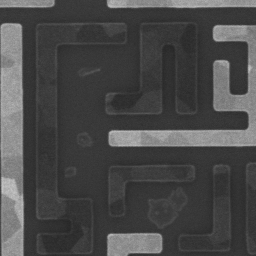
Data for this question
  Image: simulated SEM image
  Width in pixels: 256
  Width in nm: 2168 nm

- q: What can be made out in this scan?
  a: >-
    wiring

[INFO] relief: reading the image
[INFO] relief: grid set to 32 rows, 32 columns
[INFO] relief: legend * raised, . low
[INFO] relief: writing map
*******......*******************
................................
................................
***..***********..*******..*****
***..***********..*******..*****
***..***..........*******......*
***..**...........**..***......*
***..**...........**..***......*
***..**...........**..***..**..*
***..**...........**..***..**..*
***..**...........**..***..**..*
***..**..........***..***..**..*
***..**......*******..***..*****
***..**......*******..***..*****
***..**........................*
***..**........................*
***..**.......******************
***..**.......******************
***..**.........................
***..**.........................
***..**........................*
***..**.......**********...**..*
***..**.......**********...**..*
***..**.......**...........**..*
***..**.......**...........**..*
***..******...**....*......**..*
***..******...**...***.....**..*
***......**.........*......**..*
***......**................**..*
***..******...******...******..*
***..******..*******..*******..*
***..******..*******...........*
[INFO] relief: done